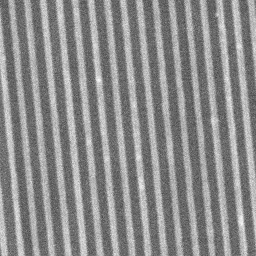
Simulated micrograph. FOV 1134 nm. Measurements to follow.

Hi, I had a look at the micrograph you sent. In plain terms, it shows parallel lines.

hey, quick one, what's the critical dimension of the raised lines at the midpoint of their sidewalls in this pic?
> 20.9 nm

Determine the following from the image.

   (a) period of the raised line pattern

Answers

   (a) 70.2 nanometres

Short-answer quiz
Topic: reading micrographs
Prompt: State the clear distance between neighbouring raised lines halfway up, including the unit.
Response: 11.3 px